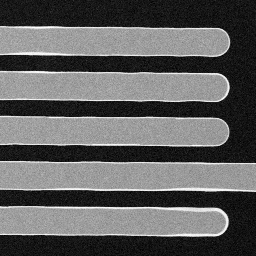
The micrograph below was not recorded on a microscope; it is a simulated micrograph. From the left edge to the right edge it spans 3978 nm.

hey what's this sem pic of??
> groups of lines, slits or small figures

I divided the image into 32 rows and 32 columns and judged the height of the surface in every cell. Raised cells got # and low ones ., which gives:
................................
................................
................................
##################..............
#############################...
#############################...
############################....
................................
................................
############################....
#############################...
############################....
......######################....
................................
................................
############################....
#############################...
############################....
................................
................................
################################
################################
################################
################################
................................
................................
############################....
############################....
############################....
................................
................................
................................